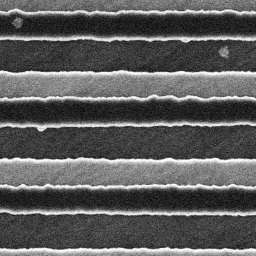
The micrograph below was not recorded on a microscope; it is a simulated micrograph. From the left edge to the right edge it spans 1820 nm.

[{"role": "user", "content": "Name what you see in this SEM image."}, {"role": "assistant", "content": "lines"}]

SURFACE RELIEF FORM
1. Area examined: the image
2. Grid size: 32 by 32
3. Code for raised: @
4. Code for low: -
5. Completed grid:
@@@@@@@@@@@@@@@@@@@@@@@@@@@@@@@@
@@@@@@@@@@@@@@@@@@@@@@@@@@@@@@@@
@@@@@@@@@@@@@@@@@@@@@@@@@@@@@@@@
@@@@@@@@@@@@@@@@@@@@@@@@@@@@@@@@
@@@@@@@@@@@@@@@@@@@@@@@@@@@@@@@@
--------------------------------
--------------------------------
--------------------------------
--------------------------------
@@@@@@@@@@@@@@@@@@@@@@@@@@@@@@@@
@@@@@@@@@@@@@@@@@@@@@@@@@@@@@@@@
@@@@@@@@@@@@@@@@@@@@@@@@@@@@@@@@
@@@@@@@@@@@@@@@@@@@@@@@@@@@@@@@@
@@@@@@@@@@@@@@@@@@@@@@@@@@@@@@@@
@@@@@@@@@@@@@@@@@@@@@@@@@@@@@@@@
@@@@@@@@@@@@@@@@@@@@@@@@@@@@@@-@
--------------------------------
--------------------------------
--------------------------------
--------------------------------
@@@@@@@@@@@@@@@@@@@@@@@@@@@@@@@@
@@@@@@@@@@@@@@@@@@@@@@@@@@@@@@@@
@@@@@@@@@@@@@@@@@@@@@@@@@@@@@@@@
@@@@@@@@@@@@@@@@@@@@@@@@@@@@@@@@
@@@@@@@@@@@@@@@@@@@@@@@@@@@@@@@@
@@@@@@@@@@@@@@@@@@@@@@@@@@@@@@@@
-@@@@@@@@@@@@@@@@@@@@@@@@@@@@@@@
--------------------------------
--------------------------------
--------------------------------
--------------------------------
@@@@@@@@@@@@@@@@@@@@@@@@@@@@@@@@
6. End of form